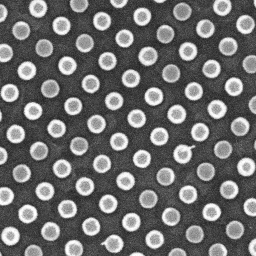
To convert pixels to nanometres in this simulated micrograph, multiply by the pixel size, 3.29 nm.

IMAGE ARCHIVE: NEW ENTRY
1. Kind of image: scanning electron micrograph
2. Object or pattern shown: a regular array of raised bodies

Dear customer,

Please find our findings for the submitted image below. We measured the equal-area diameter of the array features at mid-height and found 17.3 pixels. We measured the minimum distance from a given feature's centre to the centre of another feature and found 92.4 nm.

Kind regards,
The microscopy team